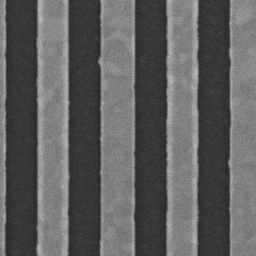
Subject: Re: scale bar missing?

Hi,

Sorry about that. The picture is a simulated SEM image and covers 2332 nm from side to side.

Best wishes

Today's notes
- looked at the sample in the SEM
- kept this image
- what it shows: lines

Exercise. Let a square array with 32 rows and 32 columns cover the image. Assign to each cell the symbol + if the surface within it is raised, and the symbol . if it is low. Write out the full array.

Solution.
+....+++.....++++....++++....+++
+....+++.....++++....++++....+++
+....+++.....++++....++++....+++
+....+++.....++++....++++....+++
+....+++.....++++....++++....+++
+....+++.....++++....++++....+++
+....+++.....++++....++++....+++
+....+++.....++++....++++....+++
+....+++.....++++....++++....+++
+....+++.....++++....++++....+++
+....+++.....++++....++++....+++
+....+++.....++++....+++.....+++
+....+++.....++++....+++.....+++
+....+++.....++++....+++.....+++
+....+++.....++++....++++....+++
+....+++.....++++....++++....+++
+....+++.....++++....++++....+++
+....+++.....++++....++++....+++
+....+++.....++++....++++....+++
+....+++.....++++....++++....+++
+....+++.....++++....++++....+++
+....+++.....++++....++++....+++
+....+++.....++++....++++....+++
+....+++.....++++....+++.....+++
+....+++.....++++....+++.....+++
+....+++.....++++....+++.....+++
+....+++.....++++....++++....+++
+....+++.....++++....+++.....+++
+....+++.....++++....+++.....+++
+....+++.....++++....+++.....+++
+....+++.....++++....+++.....+++
+....+++.....++++....+++.....+++